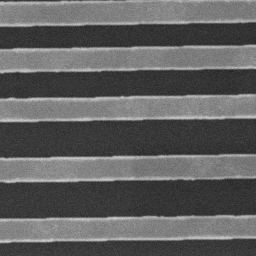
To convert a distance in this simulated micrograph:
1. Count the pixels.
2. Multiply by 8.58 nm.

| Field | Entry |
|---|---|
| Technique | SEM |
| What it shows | lines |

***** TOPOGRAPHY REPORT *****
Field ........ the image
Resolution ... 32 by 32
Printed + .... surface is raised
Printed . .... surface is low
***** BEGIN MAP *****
++++++++++++++++++++++++++++++++
++++++++++++++++++++++++++++++++
++++++++++++++++++++++++++++++++
................................
................................
................................
++++++++++++++++++++++++++++++++
++++++++++++++++++++++++++++++++
+++++++++++++++++++++++++++++++.
................................
................................
................................
++++++++++++++++++++++++++++++++
++++++++++++++++++++++++++++++++
++++++++++++++++++++++++++++++++
................................
................................
................................
................................
.....................+++++++++++
++++++++++++++++++++++++++++++++
++++++++++++++++++++++++++++++++
++++++++++++++..................
................................
................................
................................
................................
++++++++++++++++++++++++++++++++
++++++++++++++++++++++++++++++++
++++++++++++++++++++++++++++++++
................................
................................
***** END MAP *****